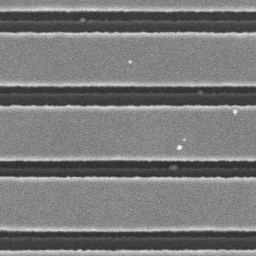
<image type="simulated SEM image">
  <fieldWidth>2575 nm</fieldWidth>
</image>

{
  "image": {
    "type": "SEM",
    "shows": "lines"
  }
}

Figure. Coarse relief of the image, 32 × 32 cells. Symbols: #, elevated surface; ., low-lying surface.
################################
................................
................................
................................
################################
################################
################################
################################
################################
################################
################################
................................
................................
################################
################################
################################
################################
################################
################################
################################
................................
................................
################################
################################
################################
################################
################################
################################
################################
................................
................................
################################